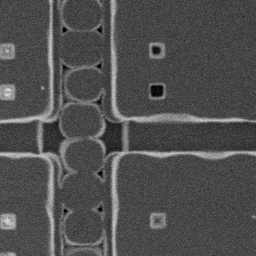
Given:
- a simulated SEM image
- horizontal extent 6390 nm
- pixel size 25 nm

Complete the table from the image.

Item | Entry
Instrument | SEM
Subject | wiring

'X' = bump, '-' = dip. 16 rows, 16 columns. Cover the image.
XXX----XXXXXXXXX
XXX----XXXXXXXXX
XXX----XXXXXXXXX
XXX----XXXXXXXXX
XXX----XXXXXXXXX
XXX----XXXXXXXXX
XXX----XXXXXXXXX
X--------------X
----------------
----------------
XXX----XXXXXXXXX
XXX----XXXXXXXXX
XXX----XXXXXXXXX
XXX----XXXXXXXXX
XXX----XXXXXXXXX
XXX----XXXXXXXXX